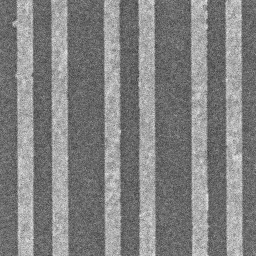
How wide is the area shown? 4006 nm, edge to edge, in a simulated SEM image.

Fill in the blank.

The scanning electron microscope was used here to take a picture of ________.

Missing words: parallel lines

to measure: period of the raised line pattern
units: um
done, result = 0.653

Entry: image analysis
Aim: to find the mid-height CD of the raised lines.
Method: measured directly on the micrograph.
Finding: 221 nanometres